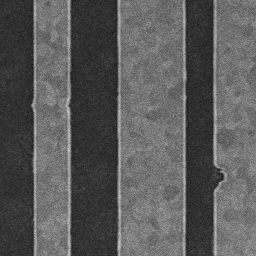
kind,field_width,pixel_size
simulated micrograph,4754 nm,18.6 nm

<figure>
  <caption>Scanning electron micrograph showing one or a few lines or trenches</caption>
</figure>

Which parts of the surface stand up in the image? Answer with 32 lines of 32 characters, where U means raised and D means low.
DDDDUUUUUDDDDDDUUUUUUUUDDDDUUUUU
DDDDUUUUUDDDDDDUUUUUUUUDDDDUUUUU
DDDDUUUUUDDDDDDUUUUUUUUDDDDUUUUU
DDDDUUUUUDDDDDDUUUUUUUUDDDDUUUUU
DDDDUUUUUDDDDDDUUUUUUUUDDDDUUUUU
DDDDUUUUUDDDDDDUUUUUUUUDDDDUUUUU
DDDDUUUUUDDDDDDUUUUUUUUDDDDUUUUU
DDDDUUUUUDDDDDDUUUUUUUUDDDDUUUUU
DDDDUUUUUDDDDDDUUUUUUUUDDDDUUUUU
DDDDUUUUUDDDDDDUUUUUUUUDDDDUUUUU
DDDDUUUUUDDDDDDUUUUUUUUDDDDUUUUU
DDDDDUUUUDDDDDDUUUUUUUUDDDDUUUUU
DDDDUUUUUDDDDDDUUUUUUUUDDDDUUUUU
DDDDUUUUDDDDDDDUUUUUUUUDDDDUUUUU
DDDDDUUUUDDDDDDUUUUUUUUDDDDUUUUU
DDDDDUUUUDDDDDDUUUUUUUUDDDDUUUUU
DDDDDUUUUDDDDDDUUUUUUUUDDDDUUUUU
DDDDDUUUUDDDDDDUUUUUUUUDDDDUUUUU
DDDDDUUUUDDDDDDUUUUUUUUDDDDUUUUU
DDDDDUUUUDDDDDDUUUUUUUUDDDDUUUUU
DDDDDUUUUDDDDDDUUUUUUUUDDDDUUUUU
DDDDDUUUUDDDDDDUUUUUUUUDDDDDUUUU
DDDDDUUUUDDDDDDUUUUUUUUDDDDDUUUU
DDDDUUUUUDDDDDDUUUUUUUUDDDDUUUUU
DDDDUUUUUDDDDDDUUUUUUUUDDDDUUUUU
DDDDUUUUUDDDDDDUUUUUUUUDDDDUUUUU
DDDDUUUUUDDDDDDUUUUUUUUDDDDUUUUU
DDDDUUUUUDDDDDDUUUUUUUUDDDDUUUUU
DDDDUUUUUDDDDDDUUUUUUUUDDDDUUUUU
DDDDDUUUUDDDDDDUUUUUUUUDDDDUUUUU
DDDDDUUUUDDDDDDUUUUUUUUDDDDUUUUU
DDDDUUUUUDDDDDDUUUUUUUUDDDDUUUUU